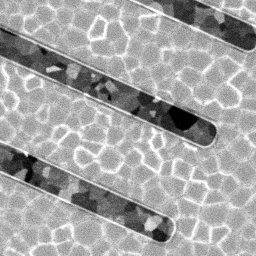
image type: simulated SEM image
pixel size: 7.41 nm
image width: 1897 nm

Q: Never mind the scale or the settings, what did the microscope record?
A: one or a few lines or trenches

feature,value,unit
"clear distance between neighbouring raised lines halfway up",578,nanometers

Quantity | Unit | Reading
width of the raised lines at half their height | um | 0.204